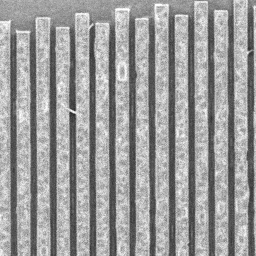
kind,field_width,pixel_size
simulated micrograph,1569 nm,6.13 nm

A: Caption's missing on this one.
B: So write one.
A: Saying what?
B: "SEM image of parallel lines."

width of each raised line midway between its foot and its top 80.4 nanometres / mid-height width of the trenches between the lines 0.0429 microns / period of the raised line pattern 121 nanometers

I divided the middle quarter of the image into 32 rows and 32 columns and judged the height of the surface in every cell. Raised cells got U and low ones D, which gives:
UDDUUUDDUUUDDUUUDDUUUDDUUUDDUUUD
UDDUUUDDUUUDDUUUDDUUUDDUUUDDUUUD
UDDUUUDDUUUDDUUUDDUUUDDUUUDDUUUD
UDDUUUDDUUUDDUUUDDUUUDDUUUDDUUUD
UDDUUUDDUUUDDUUUDDUUUDDUUUDDUUUD
UDDUUUDDUUUDDUUUDDUUUDDUUUDDUUUD
UDDUUUDDUUUDDUUUDDUUUDDUUUDDUUUD
UDDUUUDDUUUDDUUUDDUUUDDUUUDDUUUD
UDDUUUDDUUUDDUUUDDUUUDDUUUDDUUUD
UDDUUUDDUUUDDUUUDDUUUDDUUUDDUUUD
UDDUUUDDUUUDDUUUDDUUUDDUUUDDUUUD
UUDUUUDDUUUDDUUUDDUUUDDUUUDDUUUD
UDDUUUDDUUUDDUUUDDUUUDDUUUDDUUUD
UDDUUUDDUUUDDUUUDDUUUDDUUUDDUUUD
UDDUUUDDUUUDDUUUDDUUUDDUUUDDUUUD
UDDUUUDDUUUDDUUUDDUUUDDUUUDDUUUD
UDDUUUDDUUUDDUUUDDUUUDDUUUDDUUUD
UDDUUUDDUUUDDUUUDDUUUDDUUUDDUUUD
UDDUUUDDUUUDDUUUDDUUUDDUUUDDUUUD
UDDUUUDDUUUDDUUUDDUUUDDUUUDDUUUD
UDDUUUDDUUUDDUUUDDUUUDDUUUDDUUUD
UDDUUUDDUUUDDUUUDDUUUDDUUUDDUUUD
UDDUUUDDUUUDDUUUDDUUUDDUUUDDUUUD
UDDUUUDDUUUDDUUUDDUUUDDUUUDDUUUD
UDDUUUDDUUUDDUUUDDUUUDDUUUDDUUUD
UDDUUUDDUUUDDUUUDDUUUDDUUUDDUUUD
UDDUUUDDUUUDDUUUDDUUUDDUUUDDUUUD
UDDUUUDDUUUDDUUUDDUUUDDUUUDDUUUD
UDDUUUDDUUUDDUUUDDUUUDDUUUDDUUUD
UDDUUUDDUUUDDUUUDDUUUDDUUUDDUUUD
UDDUUUDDUUUDDUUUDDUUUDDUUUDDUUUD
UDDUUUDDUUUDDUUUDDUUUDDUUUDDUUUD